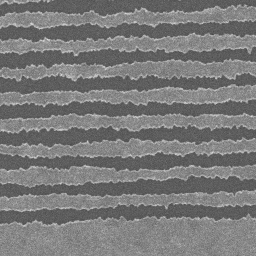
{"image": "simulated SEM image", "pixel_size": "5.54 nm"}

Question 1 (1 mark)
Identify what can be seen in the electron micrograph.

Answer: parallel lines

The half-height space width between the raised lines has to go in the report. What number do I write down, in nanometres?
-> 74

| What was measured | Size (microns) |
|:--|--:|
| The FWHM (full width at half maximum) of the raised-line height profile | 0.0699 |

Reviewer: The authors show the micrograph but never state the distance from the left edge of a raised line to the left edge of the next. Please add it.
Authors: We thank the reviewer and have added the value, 0.144 µm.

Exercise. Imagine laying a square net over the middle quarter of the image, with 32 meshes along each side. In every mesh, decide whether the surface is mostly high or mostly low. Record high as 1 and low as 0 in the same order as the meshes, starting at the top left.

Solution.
11111111110001111111111111111111
11111111111111111111111111111111
11111111111111111111111111111111
01110000000000000110000001101000
00000000000000000000000000000000
00000000000000000000000000000000
00000000000100000100001111111100
11111111111111111111111111111111
11111111111111111111111111111111
11001000000111010111100011110111
00000000000000000000000000000000
00000000000000000000000000000000
00000000000000000000000000000000
11111111111111111111111111111111
11111111111111111111111111111111
11111111111011111111111101101110
10000000000001001110000000000000
00000000000000000000000000000000
00000000000000000000000000000000
00000001011111101111110111111000
10111111111111111111111111111111
11111111111111111111111111111111
11111111111111111111111000001110
00000000000000000000000000000000
00000000000000000000000000000000
00000100000000000000000000000001
11111111111110000001110000111111
11111111111111111111111111111111
11111111111111111111111111101110
11111101101010000000000000000000
00000000000000000000000000000000
00000000000000000000000000000000